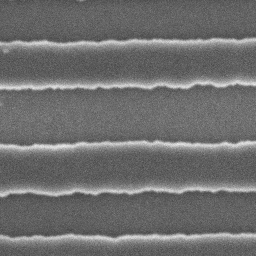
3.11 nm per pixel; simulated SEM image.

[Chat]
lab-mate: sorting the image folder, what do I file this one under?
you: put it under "lines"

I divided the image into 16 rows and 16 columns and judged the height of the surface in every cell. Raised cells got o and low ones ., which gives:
................
................
.............ooo
oooooooooooooooo
oooooooooooooooo
oooooo..........
................
................
................
oooooooooooooooo
oooooooooooooooo
oooooooooooooooo
................
................
................
oooooooooooooooo